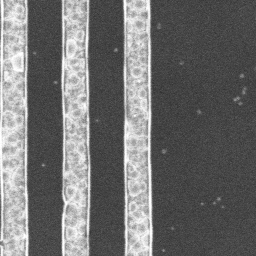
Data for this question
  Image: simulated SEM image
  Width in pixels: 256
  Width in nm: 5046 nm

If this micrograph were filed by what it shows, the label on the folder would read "parallel lines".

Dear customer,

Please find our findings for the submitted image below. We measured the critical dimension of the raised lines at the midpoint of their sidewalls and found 742 nanometres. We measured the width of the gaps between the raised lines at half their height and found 466 nm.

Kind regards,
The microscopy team